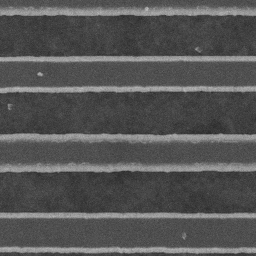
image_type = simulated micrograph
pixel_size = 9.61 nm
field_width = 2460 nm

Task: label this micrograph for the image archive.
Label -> lines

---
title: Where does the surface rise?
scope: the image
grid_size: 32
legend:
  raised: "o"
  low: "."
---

oooooooooooooooooooooooooooooooo
oooooooooooooooooooooooooooooooo
................................
................................
................................
................................
................................
oooooooooooooooooooooooooooooooo
oooooooooooooooooooooooooooooooo
oooooooooooooooooooooooooooooooo
oooooooooooooooooooooooooooooooo
................................
................................
................................
................................
................................
................................
oooooooooooooooooooooooooooooooo
oooooooooooooooooooooooooooooooo
oooooooooooooooooooooooooooooooo
oooooooooooooooooooooooooooooooo
................................
................................
................................
................................
................................
................................
oooooooooooooooooooooooooooooooo
oooooooooooooooooooooooooooooooo
oooooooooooooooooooooooooooooooo
oooooooooooooooooooooooooooooooo
................................